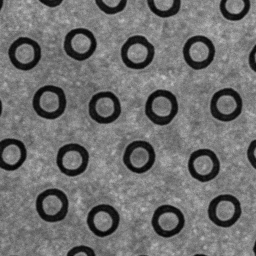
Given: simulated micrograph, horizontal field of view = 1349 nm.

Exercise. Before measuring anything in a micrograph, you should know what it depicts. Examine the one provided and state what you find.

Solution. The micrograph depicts a regular array of ring-shaped grooves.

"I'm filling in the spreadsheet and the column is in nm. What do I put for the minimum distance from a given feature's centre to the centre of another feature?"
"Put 290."